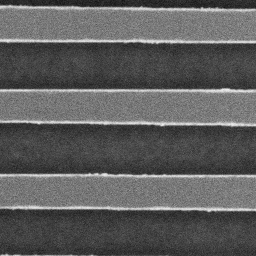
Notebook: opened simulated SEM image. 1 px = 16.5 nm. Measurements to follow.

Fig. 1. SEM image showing lines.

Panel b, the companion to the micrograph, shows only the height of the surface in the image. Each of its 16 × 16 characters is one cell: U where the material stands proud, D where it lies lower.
UUUUUUUUUUDDDDDD
UUUUUUUUUUUUUUUU
UUUUUUUUUUUUUUUU
DDDDDDDDDDDDDDDD
DDDDDDDDDDDDDDDD
DDDDDDDDDDDDDDDD
UUUUUUUUUUUUUUUU
UUUUUUUUUUUUUUUU
DDDDDDDDDDDDDDDD
DDDDDDDDDDDDDDDD
DDDDDDDDDDDDDDDD
UUUUUUUUUUUUUUUU
UUUUUUUUUUUUUUUU
DDDDDDDDDDDDDDDD
DDDDDDDDDDDDDDDD
DDDDDDDDDDDDDDDD